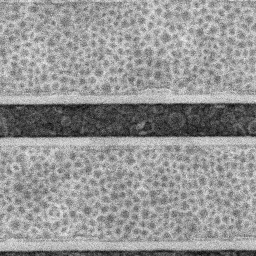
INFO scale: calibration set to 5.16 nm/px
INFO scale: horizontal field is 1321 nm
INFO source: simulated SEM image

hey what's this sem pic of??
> one or a few lines or trenches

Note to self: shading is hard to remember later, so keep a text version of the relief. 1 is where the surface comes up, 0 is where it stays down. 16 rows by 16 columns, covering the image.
1111111111111111
1111111111111111
1111111111111111
1111111111111111
1111111111111111
1111111111111111
0000000000000000
0000000000000000
0000000000000000
1111111111111111
1111111111111111
1111111111111111
1111111111111111
1111111111111111
1111111111111111
0000000000000000